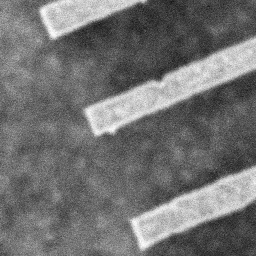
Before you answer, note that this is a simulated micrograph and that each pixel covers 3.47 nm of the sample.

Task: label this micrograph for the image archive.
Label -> one or a few lines or trenches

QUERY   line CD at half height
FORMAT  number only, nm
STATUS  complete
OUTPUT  91.2